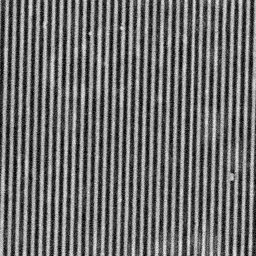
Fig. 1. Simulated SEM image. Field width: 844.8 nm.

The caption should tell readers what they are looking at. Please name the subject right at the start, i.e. parallel lines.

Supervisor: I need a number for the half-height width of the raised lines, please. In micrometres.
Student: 0.0107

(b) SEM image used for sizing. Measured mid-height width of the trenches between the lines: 15.3 nm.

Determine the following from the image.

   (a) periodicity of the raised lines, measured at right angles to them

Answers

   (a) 0.0257 µm